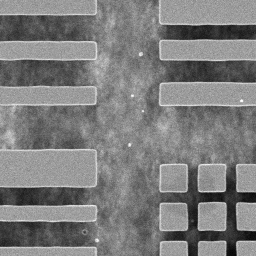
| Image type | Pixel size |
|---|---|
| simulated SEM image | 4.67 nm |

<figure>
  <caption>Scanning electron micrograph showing groups of lines, slits or small figures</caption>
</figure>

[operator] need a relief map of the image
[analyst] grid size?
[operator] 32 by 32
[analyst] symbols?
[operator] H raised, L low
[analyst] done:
HHHHHHHHHHHHLLLLLLLLHHHHHHHHHHHH
HHHHHHHHHHHHLLLLLLLLHHHHHHHHHHHH
LLLLLLLLLLLLLLLLLLLLHHHHHHHHHHHH
LLLLLLLLLLLLLLLLLLLLLLLLLLLLLLLL
LLLLLLLLLLLLLLLLLLLLLLLLLLLLLLLL
HHHHHHHHHHHHLLLLLLLLHHHHHHHHHHHH
HHHHHHHHHHHHLLLLLLLLHHHHHHHHHHHH
LLLLLLLLLLLLLLLLLLLLLLLLLLHHHLLL
LLLLLLLLLLLLLLLLLLLLLLLLLLLLLLLL
LLLLLLLLLLLLLLLLLLLLLLLLLLLLLLLL
LLLLLLLLLLLLLLLLLLLLHHHHHHHHHHHH
HHHHHHHHHHHHLLLLLLLLHHHHHHHHHHHH
HHHHHHHHHHHHLLLLLLLLHHHHHHHHHHHH
LLLLLLLLLLLLLLLLLLLLLLLLLLLLLLLL
LLLLLLLLLLLLLLLLLLLLLLLLLLLLLLLL
LLLLLLLLLLLLLLLLLLLLLLLLLLLLLLLL
LLLLLLLLLLLLLLLLLLLLLLLLLLLLLLLL
LLLLLLLLLLLLLLLLLLLLLLLLLLLLLLLL
LLLLLLLLLLLLLLLLLLLLLLLLLLLLLLLL
HHHHHHHHHHHHLLLLLLLLLLLLLLLLLLLL
HHHHHHHHHHHHLLLLLLLLLLLLLLLLLLLL
HHHHHHHHHHHHLLLLLLLLHHHLLHHHLLHH
HHHHHHHHHHHHLLLLLLLLHHHLLHHHLLHH
LLLLLLLLLLLLLLLLLLLLHHHLLHHHLLHH
LLLLLLLLLLLLLLLLLLLLLLLLLLLLLLLL
LLLLLLLLLLLLLLLLLLLLHHHLLHHHLLHH
HHHHHHHHHHHHLLLLLLLLHHHLLHHHLLHH
HHHHHHHHHHHHLLLLLLLLHHHLLHHHLLHH
LLLLLLLLLLLLLLLLLLLLHHHLLHHHLLHH
LLLLLLLLLLLLLLLLLLLLLLLLLLLLLLLL
LLLLLLLLLLLLLLLLLLLLHHHLLHHHLLHH
HHHHHHHHHHHHLLLLLLLLHHHLLHHHLLHH